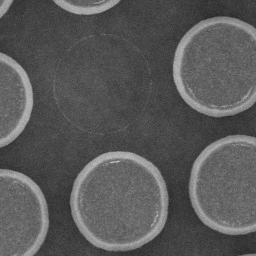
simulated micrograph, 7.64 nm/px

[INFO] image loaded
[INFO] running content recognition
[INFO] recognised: raised bodies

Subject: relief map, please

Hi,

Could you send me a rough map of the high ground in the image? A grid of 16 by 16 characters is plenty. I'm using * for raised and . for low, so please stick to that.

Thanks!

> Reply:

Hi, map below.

....**..........
.............**.
............****
...........*****
*..........*****
**.........*****
**..........****
**..............
*...............
.............***
......***...****
**...*****..****
***..*****..****
***..*****...***
***..*****......
**..............